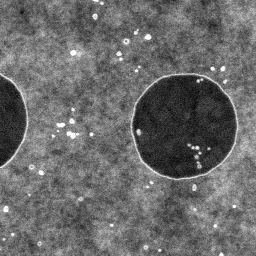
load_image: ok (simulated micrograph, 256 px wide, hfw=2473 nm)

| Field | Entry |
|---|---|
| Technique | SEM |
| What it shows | raised bodies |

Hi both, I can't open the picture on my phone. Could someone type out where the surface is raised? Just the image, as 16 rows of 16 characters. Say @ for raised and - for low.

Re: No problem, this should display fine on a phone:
----------------
----------------
----------------
----------------
----------------
@--------@@@@@--
@@-------@@@@@@-
@@------@@@@@@@-
@@------@@@@@@@-
@--------@@@@@--
---------@@@@---
----------------
----------------
----------------
----------------
----------------